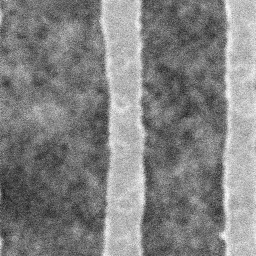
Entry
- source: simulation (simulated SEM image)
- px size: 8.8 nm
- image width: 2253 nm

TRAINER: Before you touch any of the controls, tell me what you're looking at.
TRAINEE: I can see one or a few lines or trenches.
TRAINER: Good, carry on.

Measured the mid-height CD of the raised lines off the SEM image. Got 284 nanometres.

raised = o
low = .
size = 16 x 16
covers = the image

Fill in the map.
......ooo.....oo
......ooo.....oo
.......oo.....oo
.......oo.....oo
.......oo.....oo
.......oo.....oo
.......oo.....oo
.......oo.....oo
.......oo.....oo
.......oo.....oo
.......oo.....oo
.......oo.....oo
.......oo.....oo
.......oo.....oo
.......oo.....oo
.......oo.....oo